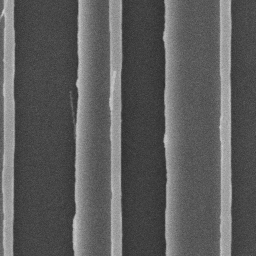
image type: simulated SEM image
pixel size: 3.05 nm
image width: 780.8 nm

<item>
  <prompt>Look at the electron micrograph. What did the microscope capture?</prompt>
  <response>lines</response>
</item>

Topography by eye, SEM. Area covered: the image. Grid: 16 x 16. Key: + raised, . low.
+....+++..++++..
+....+++..++++..
+....+++..++++..
+....+++..++++..
+....+++..++++..
+....+++..++++..
+....+++..++++..
+....+++..++++..
+....+++..++++..
+....+++..++++..
+....+++..++++..
+....+++..++++..
+....+++..++++..
+....+++..++++..
+....+++..++++..
+....+++..++++..